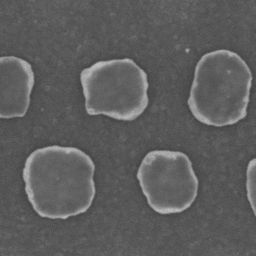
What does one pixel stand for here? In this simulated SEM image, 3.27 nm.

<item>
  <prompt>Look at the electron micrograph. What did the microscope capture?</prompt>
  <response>raised bodies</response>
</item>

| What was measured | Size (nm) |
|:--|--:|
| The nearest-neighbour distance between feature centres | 348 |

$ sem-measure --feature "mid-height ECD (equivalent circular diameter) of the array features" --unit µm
0.211